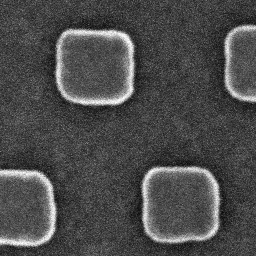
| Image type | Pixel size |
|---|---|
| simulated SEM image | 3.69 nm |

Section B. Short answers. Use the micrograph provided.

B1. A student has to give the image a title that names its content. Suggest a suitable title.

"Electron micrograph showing raised bodies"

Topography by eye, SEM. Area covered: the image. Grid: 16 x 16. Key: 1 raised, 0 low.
0000000000000000
0000000000000000
0000111100000011
0000111100000011
0000111100000011
0000111100000011
0000000000000000
0000000000000000
0000000000000000
0000000000000000
0000000000010000
1110000001111000
1110000001111100
1110000001111100
1110000001111000
0000000000000000